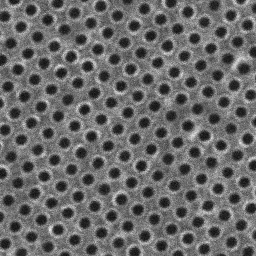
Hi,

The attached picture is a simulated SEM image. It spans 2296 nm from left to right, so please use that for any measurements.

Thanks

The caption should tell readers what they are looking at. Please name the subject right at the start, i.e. a regular array of holes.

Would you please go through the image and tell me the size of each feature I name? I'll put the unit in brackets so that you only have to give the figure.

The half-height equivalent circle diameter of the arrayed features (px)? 12.8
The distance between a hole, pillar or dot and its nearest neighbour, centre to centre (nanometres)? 172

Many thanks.